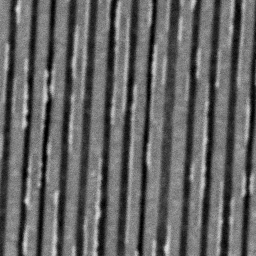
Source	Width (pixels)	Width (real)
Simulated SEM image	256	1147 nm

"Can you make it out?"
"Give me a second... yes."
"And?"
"parallel lines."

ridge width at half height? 57 nm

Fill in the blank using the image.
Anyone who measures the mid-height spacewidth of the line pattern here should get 36.3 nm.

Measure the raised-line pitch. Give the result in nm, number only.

90.9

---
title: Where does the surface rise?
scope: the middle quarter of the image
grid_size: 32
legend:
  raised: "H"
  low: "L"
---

LLHHHLLLHHHLLHHHLLHHHLHHHLLLLHHL
LLHHHLLLHHHLLHHHLLHHHLHHHLLLHHHL
LLHHHLLLHHLLLHHHLLHHHLHHHLLLHHHL
LLHHHLLLHHLLLHHHLLHHHLHHHLLLHHHL
LLHHHLLLHHLLLHHHLLHHHLHHHLLLHHHL
LLHHHLLHHHLLLHHHLLHHHLHHHLLLHHHL
LLHHHLLHHHLLLHHLLLHHLLHHHLLLHHHL
LLHHHLLHHHLLHHHLLHHHLLHHHLLLHHHL
LLHHHLLHHHLLHHHLLHHHLLHHHLLLHHHL
LLHHHLLHHHLLHHHLLHHHLLHHHLLLHHHL
LLHHHLLHHHLLHHHLLHHHLLHHHLLLHHHL
LLHHHLLHHHLLHHHLLHHHLLHHHLLLHHHL
LLHHLLLHHHLLHHHLLHHHLLHHLLLLHHHL
LLHHLLLHHHLLHHHLLHHHLLHHLLLLHHHL
LLHHLLLHHHLLHHHLLHHHLLHHLLLLHHLL
LLHHLLLHHHLLHHHLLHHHLLHHLLLHHHLL
LHHHLLLHHHLLHHHLLHHHLHHHLLLHHHLL
LHHHLLLHHHLLHHHLLHHHLHHHLLLHHHLL
LHHHLLLHHHLLHHHLLHHHLHHHLLLHHHLL
LHHHLLLHHHLLHHHLLHHHLHHHLLLHHHLL
LHHHLLLHHLLLHHLLLHHHLHHHLLLHHHLL
LHHHLLLHHLLHHHLLLHHHLHHHLLLHHHLL
LHHHLLHHHLLHHHLLLHHHLHHHLLLHHHLL
LHHHLLHHHLLHHHLLLHHHLHHHLLLHHHLL
LHHHLLHHHLLHHHLLHHHLLHHHLLLHHHLL
LHHHLLHHHLLHHHLLHHHLLHHHLLLHHHLL
LHHHLLHHHLLHHHLLLHHLLHHHLLLHHHLL
LHHHLLHHHLLHHHLLLHHLLHHHLLLHHHLL
LHHHLLHHHLLHHHLLHHHLLHHHLLLHHHLL
LHHLLLHHHLLHHHLLHHHLLHHHLLLHHHLL
LHHLLLHHHLLHHHLLHHHLLHHHLLLHHHLL
LHHLLLHHHLLHHHLLHHHLLHHHLLLHHHLL